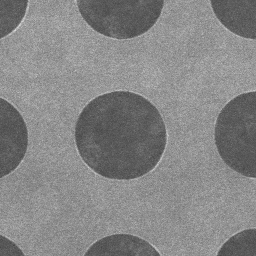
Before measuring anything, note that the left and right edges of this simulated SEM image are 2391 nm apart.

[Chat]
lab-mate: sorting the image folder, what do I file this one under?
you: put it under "holes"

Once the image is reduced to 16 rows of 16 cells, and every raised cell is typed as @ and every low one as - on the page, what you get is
--@@@-----@@@---
-@@@@-----@@@@--
@@@@@@@@@@@@@@@@
@@@@@@@@@@@@@@@@
@@@@@@@@@@@@@@@@
@@@@@@@@@@@@@@@@
-@@@@-----@@@@--
-@@@@-----@@@@--
--@@@-----@@@---
--@@@-----@@@@--
-@@@@@----@@@@--
@@@@@@@@@@@@@@@@
@@@@@@@@@@@@@@@@
@@@@@@@@@@@@@@@@
@@@@@@@@@@@@@@@-
-@@@@@----@@@@--